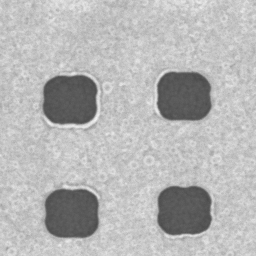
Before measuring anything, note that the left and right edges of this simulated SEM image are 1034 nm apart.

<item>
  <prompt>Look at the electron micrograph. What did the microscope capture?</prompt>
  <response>holes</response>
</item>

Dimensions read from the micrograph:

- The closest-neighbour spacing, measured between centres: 456 nanometres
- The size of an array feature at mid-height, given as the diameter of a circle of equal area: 224 nm